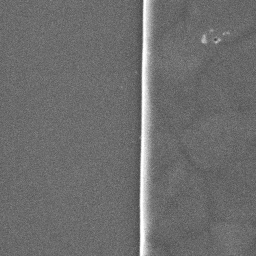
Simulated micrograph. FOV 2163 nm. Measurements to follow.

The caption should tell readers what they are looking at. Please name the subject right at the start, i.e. wiring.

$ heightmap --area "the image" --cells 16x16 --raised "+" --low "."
.........+++++++
.........+++++++
.........+++++++
.........+++++++
.........+++++++
.........+++++++
.........+++++++
.........+++++++
.........+++++++
.........+++++++
.........+++++++
.........+++++++
.........+++++++
.........+++++++
.........+++++++
.........+++++++